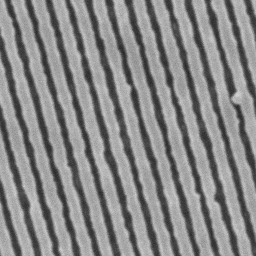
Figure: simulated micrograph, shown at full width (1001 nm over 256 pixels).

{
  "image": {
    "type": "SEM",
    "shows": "parallel lines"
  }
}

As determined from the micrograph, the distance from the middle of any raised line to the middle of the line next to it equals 75.2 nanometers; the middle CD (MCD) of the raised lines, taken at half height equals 44.4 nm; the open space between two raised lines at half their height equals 31.2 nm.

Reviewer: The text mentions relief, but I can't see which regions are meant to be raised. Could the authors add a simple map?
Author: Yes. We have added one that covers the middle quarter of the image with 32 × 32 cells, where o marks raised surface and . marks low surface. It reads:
.ooo...oo...oo..oooo..oo..ooo..o
..oo...ooo..oo...ooo..ooo.oooo.o
..ooo..ooo..ooo..ooo..ooo..ooo..
..ooo..ooo...oo..ooo..ooo..ooo..
o..ooo..oo...ooo.ooo...oo...ooo.
o..ooo..oo...ooo..ooo..ooo..ooo.
o..ooo..ooo..oooo.ooo..ooo..ooo.
o..ooo..ooo...oo...oo...ooo.ooo.
oo..ooo..oo...oo...ooo..ooo..oo.
oo..ooo..ooo..ooo..ooo..ooo..ooo
oo..ooo..ooo..ooo..ooo..ooo..ooo
oo...oo..ooo...ooo.ooo...ooo..oo
ooo..oo...ooo..ooo..oo...ooo..oo
ooo..ooo..ooo..ooo..ooo..ooo..oo
.oo..ooo..ooo..ooo..ooo..ooo..oo
.ooo.ooo...ooo..oo..ooo...oo...o
.ooo..ooo..ooo..ooo..ooo..ooo..o
.ooo..ooo..ooo..ooo..ooo..ooo..o
.ooo..ooo..ooo...oo...oo..ooo...
..ooo..ooo..oo...oo...ooo.ooo...
..ooo..ooo..ooo..ooo..ooo..ooo..
...oo..ooo..ooo..ooo..ooo..ooo..
...oo..ooo..ooo...oo...oo..ooo..
o..ooo..oo...ooo..ooo..ooo..ooo.
o..ooo..oo...ooo..ooo..ooo..ooo.
o..ooo..ooo..ooo..ooo...oo..ooo.
oo..ooo..oo...oo...ooo..oo..oooo
oo..ooo..ooo..ooo..ooo..ooo..ooo
oo..ooo..ooo..ooo..ooo..ooo..ooo
oo..ooo..ooo...oo..oooo..oo..ooo
oo...oo..oooo..ooo..ooo..oo...oo
ooo..ooo..ooo..ooo..ooo..ooo..oo